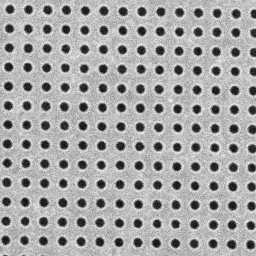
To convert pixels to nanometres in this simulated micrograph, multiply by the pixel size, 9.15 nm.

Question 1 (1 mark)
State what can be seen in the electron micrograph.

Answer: a regular array of holes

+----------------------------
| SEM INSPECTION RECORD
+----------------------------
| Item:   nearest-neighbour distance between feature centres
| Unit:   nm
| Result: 171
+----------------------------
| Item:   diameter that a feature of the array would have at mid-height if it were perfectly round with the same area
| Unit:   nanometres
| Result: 91.8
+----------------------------